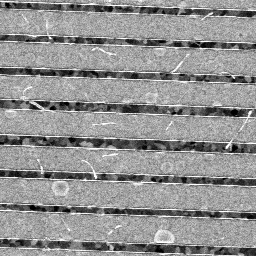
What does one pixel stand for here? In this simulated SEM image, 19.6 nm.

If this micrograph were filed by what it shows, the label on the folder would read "parallel lines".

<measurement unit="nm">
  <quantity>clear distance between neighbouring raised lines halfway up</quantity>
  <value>496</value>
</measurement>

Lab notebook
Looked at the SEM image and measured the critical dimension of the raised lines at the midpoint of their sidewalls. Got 0.154 µm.